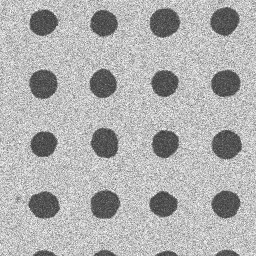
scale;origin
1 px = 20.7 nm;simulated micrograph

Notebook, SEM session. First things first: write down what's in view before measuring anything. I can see a regular array of holes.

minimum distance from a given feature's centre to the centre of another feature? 1.25 microns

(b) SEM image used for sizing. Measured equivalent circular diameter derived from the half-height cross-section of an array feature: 591 nm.